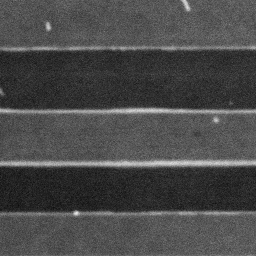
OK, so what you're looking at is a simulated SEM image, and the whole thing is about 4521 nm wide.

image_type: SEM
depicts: lines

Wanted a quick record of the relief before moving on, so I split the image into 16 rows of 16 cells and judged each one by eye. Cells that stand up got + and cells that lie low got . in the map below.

++++++++++++++++
++++++++++++++++
++++++++++++++++
................
................
................
................
++++++++++++++++
++++++++++++++++
++++++++++++++++
................
................
................
++++++++++++++++
++++++++++++++++
++++++++++++++++